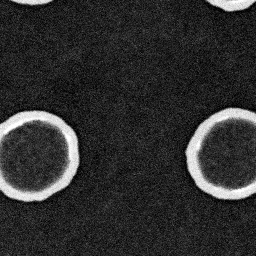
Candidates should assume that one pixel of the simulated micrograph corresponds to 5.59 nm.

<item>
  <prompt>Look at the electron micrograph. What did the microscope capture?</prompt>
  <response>raised bodies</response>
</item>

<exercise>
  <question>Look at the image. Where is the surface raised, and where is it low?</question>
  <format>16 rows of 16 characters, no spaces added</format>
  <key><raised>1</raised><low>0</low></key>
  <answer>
0000000000000000
0000000000000000
0000000000000000
0000000000000000
0000000000000000
0000000000000000
0000000000000000
0110000000000111
1111000000001111
1111100000001111
1111100000001111
1111000000000111
0000000000000000
0000000000000000
0000000000000000
0000000000000000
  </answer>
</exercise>